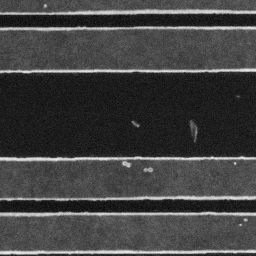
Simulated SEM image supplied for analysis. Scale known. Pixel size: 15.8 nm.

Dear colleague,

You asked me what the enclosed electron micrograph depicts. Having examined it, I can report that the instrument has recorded lines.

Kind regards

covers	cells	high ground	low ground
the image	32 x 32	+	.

++++++++++++++++++++++++++++++++
++++++++++++++++++++++......++++
................................
................................
++++++++++++++++++++++++++++++++
++++++++++++++++++++++++++++++++
++++++++++++++++++++++++++++++++
++++++++++++++++++++++++++++++++
++++++++++++++++++++++++++++++++
................................
................................
................................
................................
................................
................................
................................
................................
................................
................................
................................
++++++++++++++++++++++++++++++++
++++++++++++++++++++++++++++++++
++++++++++++++++++++++++++++++++
++++++++++++++++++++++++++++++++
++++++++++++++++++++++++++++++++
................................
................................
++++++++++++++++++++++++++++++++
++++++++++++++++++++++++++++++++
++++++++++++++++++++++++++++++++
++++++++++++++++++++++++++++++++
++++++++++++++++++++++++++.+++..